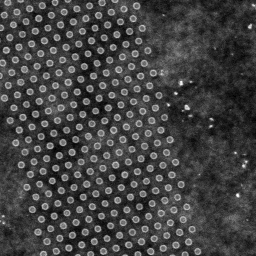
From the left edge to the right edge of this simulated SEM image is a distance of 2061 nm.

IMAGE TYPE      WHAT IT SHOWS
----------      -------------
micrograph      a regular array of raised bodies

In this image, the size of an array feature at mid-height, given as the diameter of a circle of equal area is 6.19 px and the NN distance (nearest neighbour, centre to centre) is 0.104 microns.